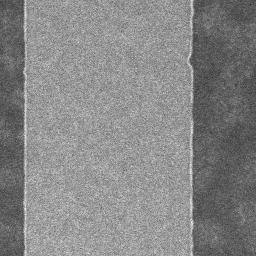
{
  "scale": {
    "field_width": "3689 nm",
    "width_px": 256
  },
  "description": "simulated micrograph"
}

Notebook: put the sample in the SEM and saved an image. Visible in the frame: one or a few lines or trenches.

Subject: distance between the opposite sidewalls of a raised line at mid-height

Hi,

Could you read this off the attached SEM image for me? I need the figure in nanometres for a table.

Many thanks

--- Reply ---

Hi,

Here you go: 2400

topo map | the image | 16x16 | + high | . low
..++++++++++....
..++++++++++....
..++++++++++....
..++++++++++....
..++++++++++....
..++++++++++....
..++++++++++....
..++++++++++....
..++++++++++....
..++++++++++....
..++++++++++....
..++++++++++....
..++++++++++....
..++++++++++....
..++++++++++....
..++++++++++....